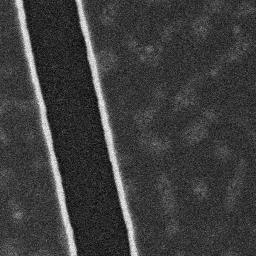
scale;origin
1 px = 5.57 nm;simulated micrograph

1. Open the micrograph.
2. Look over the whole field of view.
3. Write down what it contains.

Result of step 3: one or a few lines or trenches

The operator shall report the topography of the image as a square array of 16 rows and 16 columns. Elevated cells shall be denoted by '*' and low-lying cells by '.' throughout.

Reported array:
*....***********
*....***********
**...***********
**....**********
**....**********
**....**********
***...**********
***....*********
***....*********
***....*********
***....*********
****...*********
****....********
****....********
****....********
*****...********